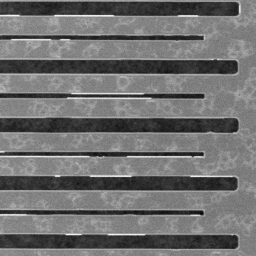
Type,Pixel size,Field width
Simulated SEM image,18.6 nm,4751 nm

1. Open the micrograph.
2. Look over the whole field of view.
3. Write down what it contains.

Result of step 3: parallel lines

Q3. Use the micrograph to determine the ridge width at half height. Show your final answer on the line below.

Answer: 350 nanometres